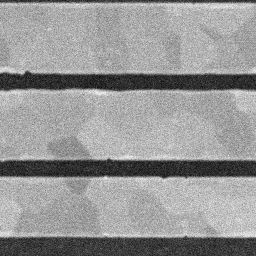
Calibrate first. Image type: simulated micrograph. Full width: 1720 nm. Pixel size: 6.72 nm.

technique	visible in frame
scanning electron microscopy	one or a few lines or trenches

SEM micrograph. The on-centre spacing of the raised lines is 567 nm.